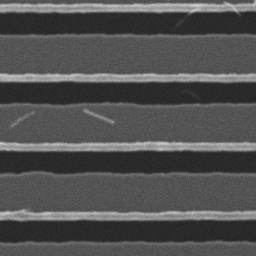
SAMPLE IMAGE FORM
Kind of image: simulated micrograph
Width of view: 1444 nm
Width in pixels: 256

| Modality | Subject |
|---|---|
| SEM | lines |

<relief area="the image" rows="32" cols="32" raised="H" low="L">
HHHHHHHHHHHHHHHHHHHHHHHHHHHHHHHH
HLHHHHHHHHHLLLLLLLLHHLLHHLLLLHLL
LLLLLLLLLLLLLLLLLLLLLLLLLLLLLLLL
LLLLLLLLLLLLLLLLLLLLLLLLLLLLLLLL
HHHHHHHHHHHHHHHHHHHHHHHHHHHHHHHH
HHHHHHHHHHHHHHHHHHHHHHHHHHHHHHHH
HHHHHHHHHHHHHHHHHHHHHHHHHHHHHHHH
HHHHHHHHHHHHHHHHHHHHHHHHHHHHHHHH
HHHHHHHHHHHHHHHHHHHHHHHHHHHHHHHH
HHHHHHHHHHHHHHHHHHHHHHHHHHHHHHHH
LLLLLLLLLLLLLLLLLLLLLLLLLLLLLLLL
LLLLLLLLLLLLLLLLLLLLLLLLLLLLLLLL
LLLLLLLLLLLLLLLLLLLLLLLLLLLLLLLL
HHHHHHHHHHHHHHHHHHHHHHHHHHHHHHHH
HHHHHHHHHHHHHHHHHHHHHHHHHHHHHHHH
HHHHHHHHHHHHHHHHHHHHHHHHHHHHHHHH
HHHHHHHHHHHHHHHHHHHHHHHHHHHHHHHH
HHHHHHHHHHHHHHHHHHHHHHHHHHHHHHHH
HHHHHHHHHHHHHHHHHHHHHHHHHHHHHHHH
LLLLLLLLLLLLLLLLLLLLLLLLLLLLLLLL
LLLLLLLLLLLLLLLLLLLLLLLLLLLLLLLL
LLLLLLLLLLLLLLLLLLLLLLLLLLLLLLLL
HHHHHHHHHHHHHHHHHHHHHHHHHHHHHHHH
HHHHHHHHHHHHHHHHHHHHHHHHHHHHHHHH
HHHHHHHHHHHHHHHHHHHHHHHHHHHHHHHH
HHHHHHHHHHHHHHHHHHHHHHHHHHHHHHHH
HHHHHHHHHHHHHHHHHHHHHHHHHHHHHHHH
LLHHLLLLLLLLLLLLLLLLLLLLLLLLLLLL
LLLLLLLLLLLLLLLLLLLLLLLLLLLLLLLL
LLLLLLLLLLLLLLLLLLLLLLLLLLLLLLLL
HHHHHHHHHHHHHHHHHHHHHHHHHHHHHHHH
HHHHHHHHHHHHHHHHHHHHHHHHHHHHHHHH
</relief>